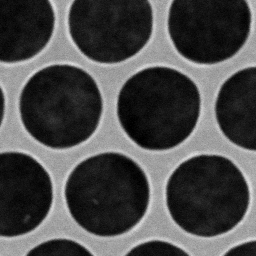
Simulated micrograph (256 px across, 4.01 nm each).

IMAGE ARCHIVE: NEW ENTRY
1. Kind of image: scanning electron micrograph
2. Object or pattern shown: holes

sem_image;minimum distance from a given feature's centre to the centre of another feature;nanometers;396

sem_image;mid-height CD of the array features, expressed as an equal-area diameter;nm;336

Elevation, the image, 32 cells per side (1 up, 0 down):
00000011100000000001100000000001
00000001100000000001100000000001
00000001000000000001100000000001
00000001100000000001100000000001
00000001100000000001100000000001
00000011100000000011110000000001
00000111110000000111110000000011
00011111111100001111111100001111
11111100001111111100011111111110
11110000000111111000000111111000
11100000000011110000000011110000
11100000000011100000000001100000
01000000000001100000000001100000
01000000000001100000000001100000
11100000000001100000000001100000
11100000000011100000000001100000
11110000000011110000000011110000
11110000000111110000000111111000
11111100011111111100011111111100
00001111111100001111111110001111
00000111110000000111111000000111
00000011100000000011110000000011
00000011000000000011100000000001
00000001000000000001100000000001
00000001000000000001100000000001
00000011000000000001100000000001
00000011100000000011100000000001
00000011100000000011110000000011
00000111110000000111111000000111
00111111111100111111111110011111
11111000001111111100011111111100
11110000000111110000000111110000